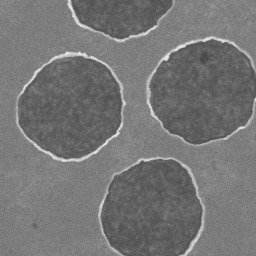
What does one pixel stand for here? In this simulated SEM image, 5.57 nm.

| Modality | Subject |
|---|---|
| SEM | holes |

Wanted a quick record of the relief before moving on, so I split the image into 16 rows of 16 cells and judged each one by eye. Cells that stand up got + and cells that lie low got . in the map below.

+++++......+++++
+++++.....++++++
++++++++++++++++
+++++++++++....+
++.....+++......
++.....++.......
+.......+.......
+.......++......
++.....++++...++
+++...++++++++++
++++++++....++++
+++++++.....++++
+++++++.....++++
++++++.......+++
++++++......++++
+++++++.....++++